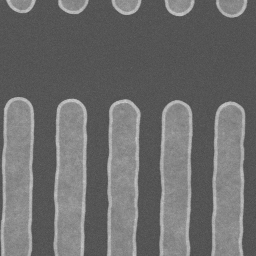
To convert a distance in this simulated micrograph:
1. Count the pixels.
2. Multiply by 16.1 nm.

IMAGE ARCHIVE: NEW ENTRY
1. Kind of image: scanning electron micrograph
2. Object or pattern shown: groups of lines, slits or small figures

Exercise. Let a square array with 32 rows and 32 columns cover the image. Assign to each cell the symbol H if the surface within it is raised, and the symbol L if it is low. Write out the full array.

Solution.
LHHHLLLHHHHLLLHHHLLLLHHHLLLHHHHL
LLLLLLLLLHLLLLLHHLLLLLHLLLLLHHLL
LLLLLLLLLLLLLLLLLLLLLLLLLLLLLLLL
LLLLLLLLLLLLLLLLLLLLLLLLLLLLLLLL
LLLLLLLLLLLLLLLLLLLLLLLLLLLLLLLL
LLLLLLLLLLLLLLLLLLLLLLLLLLLLLLLL
LLLLLLLLLLLLLLLLLLLLLLLLLLLLLLLL
LLLLLLLLLLLLLLLLLLLLLLLLLLLLLLLL
LLLLLLLLLLLLLLLLLLLLLLLLLLLLLLLL
LLLLLLLLLLLLLLLLLLLLLLLLLLLLLLLL
LLLLLLLLLLLLLLLLLLLLLLLLLLLLLLLL
LLLLLLLLLLLLLLLLLLLLLLLLLLLLLLLL
LLHLLLLLLLLLLLLLLLLLLLLLLLLLLLLL
LHHHLLLHHHLLLLHHHLLLLHHLLLLLHHLL
LHHHLLLHHHHLLLHHHLLLHHHHLLLHHHLL
LHHHLLLHHHHLLLHHHLLLHHHHLLLHHHLL
LHHHLLLHHHHLLLHHHLLLHHHHLLLHHHLL
LHHHLLLHHHHLLLHHHLLLHHHHLLLHHHLL
LHHHLLLHHHHLLLHHHLLLHHHHLLLHHHLL
LHHHLLLHHHHLLLHHHLLLHHHHLLLHHHLL
LHHHLLLHHHHLLLHHHLLLHHHHLLLHHHLL
LHHHLLLHHHHLLLHHHLLLHHHHLLLHHHLL
LHHHLLLHHHHLLLHHHLLLHHHHLLLHHHLL
LHHHLLLHHHHLLLHHHLLLHHHHLLLHHHLL
LHHHLLLHHHHLLLHHHLLLHHHHLLLHHHLL
LHHHLLLHHHLLLLHHHLLLHHHHLLLHHHLL
HHHHLLLHHHLLLLHHHLLLHHHHLLLHHHLL
HHHHLLLHHHLLLLHHHLLLHHHHLLLHHHLL
HHHHLLLHHHLLLLHHHLLLHHHLLLLHHHLL
HHHHLLLHHHLLLLHHHLLLHHHLLLLHHHLL
HHHHLLLHHHLLLLHHHLLLHHHHLLLHHHLL
HHHHLLLHHHLLLLHHHLLLHHHHLLLHHHLL